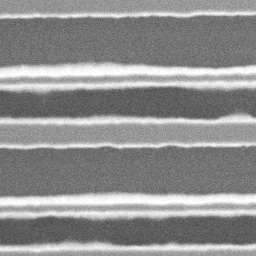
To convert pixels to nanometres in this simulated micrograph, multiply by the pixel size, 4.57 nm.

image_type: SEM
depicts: lines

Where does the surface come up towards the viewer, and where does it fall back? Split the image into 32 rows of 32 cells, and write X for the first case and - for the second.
XXXXXXXXXXXXXXXXXXXXXXXXXXXXXXXX
XXXXXXXXXXXXXXXXXXXXXXXXXXXXXXXX
--------------------------------
--------------------------------
--------------------------------
--------------------------------
--------------------------------
--------------------------------
--------------------------------
XXXXXXXXXXXXXXXXXXXXXXXXXXXXXXXX
XXXXXXXXXXXXXXXXXXXXXXXXXXX-X---
--------------------------------
--------------------------------
--------------------------------
--------------------------------
XXXXXXXXXXXXXXXXXXXXXXXXXXXXXXXX
XXXXXXXXXXXXXXXXXXXXXXXXXXXXXXXX
XXXXXXXXXXXXXXXXXXXXXXXXXXXXXXXX
--------------------------------
--------------------------------
--------------------------------
--------------------------------
--------------------------------
--------------------------------
--------------------------------
XXXXXXXXXXXXXXXXXXXXXXXXXXXXXXXX
XXXXXXXXXXXXXXXXXXXXXXXXXXXXX---
--------------------------------
--------------------------------
--------------------------------
--------------------------------
XXXXXXXXXXXXXXXXXXXXXXXXXXXXXXXX